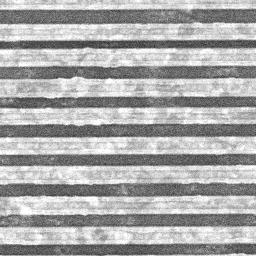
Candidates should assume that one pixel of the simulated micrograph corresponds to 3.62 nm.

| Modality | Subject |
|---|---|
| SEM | parallel lines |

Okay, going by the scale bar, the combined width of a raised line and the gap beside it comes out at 105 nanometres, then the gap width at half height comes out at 48.9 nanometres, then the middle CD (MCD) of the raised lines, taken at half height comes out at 55.7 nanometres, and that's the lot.